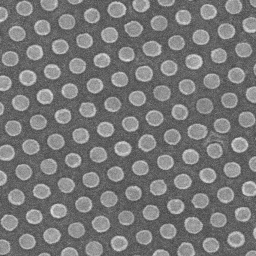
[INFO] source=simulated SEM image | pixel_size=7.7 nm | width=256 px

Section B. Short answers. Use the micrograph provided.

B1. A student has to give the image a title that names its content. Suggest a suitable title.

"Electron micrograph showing a regular array of raised bodies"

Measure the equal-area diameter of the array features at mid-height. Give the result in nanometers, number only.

118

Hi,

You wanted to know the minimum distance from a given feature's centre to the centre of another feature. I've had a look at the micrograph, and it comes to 195 nanometres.